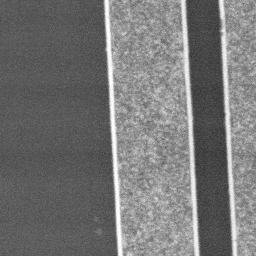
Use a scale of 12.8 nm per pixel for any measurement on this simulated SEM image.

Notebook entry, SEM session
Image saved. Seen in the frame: one or a few lines or trenches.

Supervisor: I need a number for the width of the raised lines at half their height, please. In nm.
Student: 986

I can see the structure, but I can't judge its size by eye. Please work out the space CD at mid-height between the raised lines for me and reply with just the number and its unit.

37.9 px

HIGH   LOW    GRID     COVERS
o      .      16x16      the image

.......oooo...oo
.......oooo...oo
.......ooooo..oo
.......ooooo..oo
.......ooooo..oo
.......ooooo..oo
.......ooooo..oo
.......ooooo..oo
.......ooooo..oo
.......ooooo..oo
.......ooooo..oo
.......ooooo..oo
.......ooooo...o
.......ooooo...o
.......ooooo...o
........oooo...o